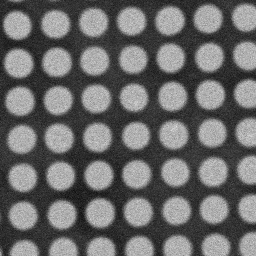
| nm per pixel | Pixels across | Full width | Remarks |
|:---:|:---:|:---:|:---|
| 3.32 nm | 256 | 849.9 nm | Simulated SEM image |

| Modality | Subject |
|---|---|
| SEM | an array of small figures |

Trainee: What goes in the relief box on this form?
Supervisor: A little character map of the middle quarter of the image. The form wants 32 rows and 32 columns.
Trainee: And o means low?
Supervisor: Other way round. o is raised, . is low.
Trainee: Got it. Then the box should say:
oo..ooooooo...oooooo....oooooo..
o....ooooo.....oooo......oooo...
.......oo.......................
................................
................................
......ooo.......ooo......oooo...
o....oooooo....ooooo....oooooo..
oo...oooooo...ooooooo...oooooo..
oo...oooooo...ooooooo...ooooooo.
oo...ooooooo..ooooooo...oooooo..
oo...oooooo....ooooo.....ooooo..
o.....oooo......ooo.......oo....
................................
................................
..........................oo....
......oooo......oooo.....ooooo..
oo....ooooo....oooooo...ooooooo.
oo...ooooooo...oooooo...ooooooo.
oo...ooooooo...oooooo...ooooooo.
oo...ooooooo...oooooo...ooooooo.
oo....ooooo.....oooo.....ooooo..
o......ooo......................
................................
................................
........o........ooo......oooo..
oo....ooooo....oooooo....oooooo.
oo....oooooo...oooooo...ooooooo.
ooo..ooooooo...oooooo...ooooooo.
ooo..ooooooo...oooooo....oooooo.
oo....oooooo...oooooo....ooooo..
oo....ooooo.....oooo.......o....
................................